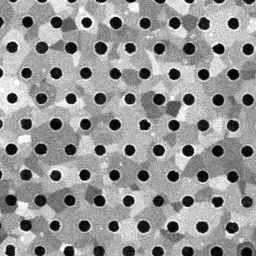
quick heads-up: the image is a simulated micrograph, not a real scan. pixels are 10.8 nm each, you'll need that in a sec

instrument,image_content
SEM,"a regular array of holes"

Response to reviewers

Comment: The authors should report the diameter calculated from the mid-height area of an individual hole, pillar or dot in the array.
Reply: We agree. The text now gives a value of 131 nanometres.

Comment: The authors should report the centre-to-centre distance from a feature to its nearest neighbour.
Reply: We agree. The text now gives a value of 314 nm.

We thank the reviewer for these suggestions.